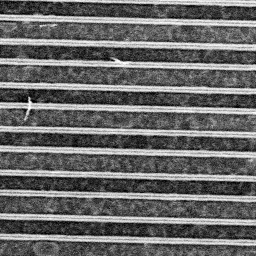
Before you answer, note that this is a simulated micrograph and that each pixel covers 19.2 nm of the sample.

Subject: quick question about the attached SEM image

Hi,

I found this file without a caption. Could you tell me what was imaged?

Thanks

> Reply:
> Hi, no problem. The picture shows parallel lines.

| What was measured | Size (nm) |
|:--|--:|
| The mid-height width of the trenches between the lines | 302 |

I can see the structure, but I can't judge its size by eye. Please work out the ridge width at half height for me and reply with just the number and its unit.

93.4 nm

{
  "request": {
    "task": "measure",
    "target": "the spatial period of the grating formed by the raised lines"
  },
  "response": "419 nanometres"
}